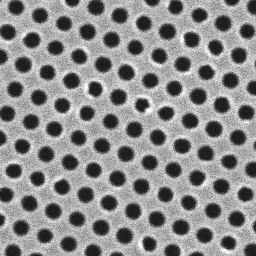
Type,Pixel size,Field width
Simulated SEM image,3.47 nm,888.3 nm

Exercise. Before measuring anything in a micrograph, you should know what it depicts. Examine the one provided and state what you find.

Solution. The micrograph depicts a regular array of holes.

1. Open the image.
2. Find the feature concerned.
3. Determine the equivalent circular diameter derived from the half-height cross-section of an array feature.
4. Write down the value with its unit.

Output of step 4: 54.7 nm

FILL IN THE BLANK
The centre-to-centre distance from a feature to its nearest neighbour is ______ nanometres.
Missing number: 86.8